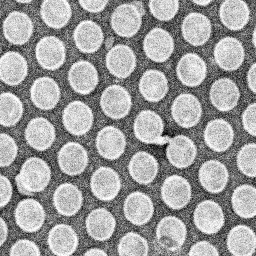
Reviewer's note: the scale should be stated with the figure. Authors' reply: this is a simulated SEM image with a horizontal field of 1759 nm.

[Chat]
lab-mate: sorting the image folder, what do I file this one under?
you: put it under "a regular array of raised bodies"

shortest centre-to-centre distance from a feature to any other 280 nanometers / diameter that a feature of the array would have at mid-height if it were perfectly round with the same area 203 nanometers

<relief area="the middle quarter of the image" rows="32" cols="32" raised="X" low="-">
--XXXXX----XXXXXX------------XXX
--XXXXXX----XXXXX-----------XXXX
--XXXXXX----XXXX----XXXXX----XXX
-XXXXXXX------------XXXXX----XXX
--XXXXXX-----------XXXXXX-----XX
--XXXXXX-----------XXXXXXX-----X
---XXXX----XXXX----XXXXXXX------
----------XXXXXX----XXXXX-------
---------XXXXXXX-----XXXX----XXX
---------XXXXXXXX-----------XXXX
-XXXX----XXXXXXXX----------XXXXX
XXXXXX----XXXXXX-----------XXXXX
XXXXXXX----XXXX----XXXX----XXXXX
XXXXXXX-----------XXXXXX----XXXX
XXXXXXX-----------XXXXXX----XXXX
XXXXXXX-----------XXXXXXX-----X-
-XXXXX----XXXX----XXXXXXX-------
---X-----XXXXX----XXXXXX--------
---------XXXXXX----XXXXXXXX-XXX-
--------XXXXXXX------XXXXXXXXXXX
XXXX----XXXXXXX-----------XXXXXX
XXXXX----XXXXXX-----------XXXXXX
XXXXX----XXXXX-----XX-----XXXXXX
XXXXXX-----XX----XXXXX----XXXXXX
XXXXXX-----------XXXXXX----XXXXX
XXXXX------------XXXXXX-----XXX-
XXXXX----XXX-----XXXXXX---------
-XX-----XXXXX----XXXXXX---------
-------XXXXXXX---XXXXXX---XXX---
-------XXXXXXX-----XX----XXXXXX-
XX-----XXXXXXX-----------XXXXXX-
XXX----XXXXXXX-----------XXXXXX-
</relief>